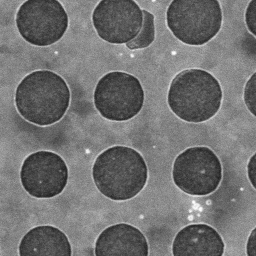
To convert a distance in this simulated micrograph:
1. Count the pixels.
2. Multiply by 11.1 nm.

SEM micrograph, holes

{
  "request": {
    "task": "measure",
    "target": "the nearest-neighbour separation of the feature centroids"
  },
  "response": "844 nm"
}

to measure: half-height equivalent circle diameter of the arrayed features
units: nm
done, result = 583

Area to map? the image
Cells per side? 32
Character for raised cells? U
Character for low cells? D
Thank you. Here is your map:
UUUDDDDDUUUUDDDDDUUUUDDDDDDUUUUD
UUDDDDDDUUUUDDDDDDDUUDDDDDDDUUUD
UUDDDDDDDUUUDDDDDDDUUDDDDDDDUUUD
UUDDDDDDUUUUDDDDDDDUUDDDDDDDUUUD
UUUDDDDDUUUUDDDDDDDUUUDDDDDUUUUU
UUUUDDDUUUUUUUDDDDDUUUUDDUUUUUUU
UUUUUUUUUUUUUUUUUUUUUUUUUUUUUUUU
UUUUUUUUUUUUUUUUUUUUUUUUUUUUUUUU
UUUUUUUUUUUUUUUUUUUUUUUUUUUUUUUU
UUUDDDDUUUUUUDDDDUUUUUDDDDDUUUUD
UUDDDDDDUUUUDDDDDDUUUDDDDDDUUUUD
UUDDDDDDDUUUDDDDDDUUUDDDDDDDUUDD
UUDDDDDDDUUUDDDDDDUUUDDDDDDDUUDD
UUDDDDDDUUUUDDDDDDUUUDDDDDDUUUUD
UUUDDDDDUUUUUDDDDUUUUUDDDDDUUUUU
UUUUDDUUUUUUUUUUUUUUUUUUUUUUUUUU
UUUUUUUUUUUUUUUUUUUUUUUUUUUUUUUU
UUUUUUUUUUUUUUUUUUUUUUUUUUUUUUUU
UUUUUUUUUUUUUUDDUUUUUUUUDDUUUUUU
UUUUDDDUUUUUDDDDDDUUUUDDDDDUUUUU
UUUDDDDDUUUUDDDDDDUUUUDDDDDDUUUD
UUUDDDDDDUUDDDDDDDUUUUDDDDDDUUUD
UUUDDDDDUUUUDDDDDDUUUUDDDDDDUUUD
UUUDDDDDUUUUDDDDDDUUUUDDDDDUUUUU
UUUUDDDUUUUUUDDDDUUUUUUUUUUUUUUU
UUUUUUUUUUUUUUUUUUUUUUUUUUUUUUUU
UUUUUUUUUUUUUUUUUUUUUUUUUUUUUUUU
UUUUUUUUUUUUUUUUUUUUUUUUUUUUUUUU
UUUUDDDUUUUUUDDDDUUUUUUDDDDUUUUU
UUUDDDDDUUUUDDDDDDUUUUDDDDDDUUUD
UUDDDDDDDUUUDDDDDDUUUUDDDDDDUUUD
UUDDDDDDDUUUDDDDDDDUUUDDDDDDUUUD